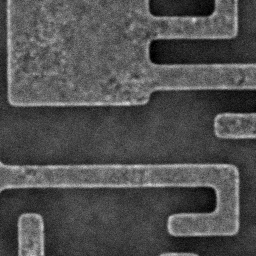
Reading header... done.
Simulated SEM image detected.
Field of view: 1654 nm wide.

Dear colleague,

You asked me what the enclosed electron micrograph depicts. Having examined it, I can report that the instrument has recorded wiring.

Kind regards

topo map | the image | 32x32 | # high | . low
.##################........###..
.##################........###..
.#############################..
.#############################..
.############################...
.##################.............
.##################.............
.##################.............
.###############################
.###############################
.###############################
.##################.............
.#################..............
................................
...........................#####
...........................#####
...........................#####
................................
................................
................................
................................
##############################..
##############################..
#..........................###..
...........................###..
...........................###..
...........................###..
..###................#########..
..###................#########..
..###...........................
..###...........................
..###...........................